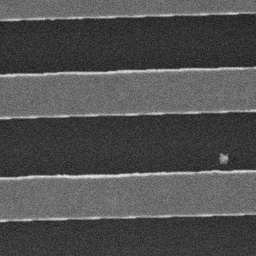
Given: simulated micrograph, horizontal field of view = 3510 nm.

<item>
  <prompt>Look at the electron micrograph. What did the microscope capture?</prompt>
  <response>lines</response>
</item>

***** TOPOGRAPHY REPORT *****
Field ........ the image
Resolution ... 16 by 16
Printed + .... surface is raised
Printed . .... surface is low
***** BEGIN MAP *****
++++++++++++++++
................
................
................
......++++++++++
++++++++++++++++
++++++++++++++++
................
................
................
................
++++++++++++++++
++++++++++++++++
+++++++++++.....
................
................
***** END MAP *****